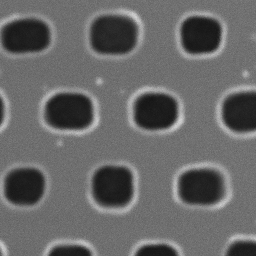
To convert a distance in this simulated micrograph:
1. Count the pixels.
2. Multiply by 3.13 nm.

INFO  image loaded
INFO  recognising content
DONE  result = a regular array of holes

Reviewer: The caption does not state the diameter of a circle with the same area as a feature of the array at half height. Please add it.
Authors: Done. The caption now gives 134 nanometres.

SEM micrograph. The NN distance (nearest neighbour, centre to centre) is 87.3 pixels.